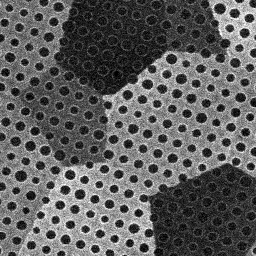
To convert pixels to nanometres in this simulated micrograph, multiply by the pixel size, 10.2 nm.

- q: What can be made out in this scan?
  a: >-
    a regular array of holes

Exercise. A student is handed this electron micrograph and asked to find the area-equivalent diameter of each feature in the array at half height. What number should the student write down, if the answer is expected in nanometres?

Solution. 101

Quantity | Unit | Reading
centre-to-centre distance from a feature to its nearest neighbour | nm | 156